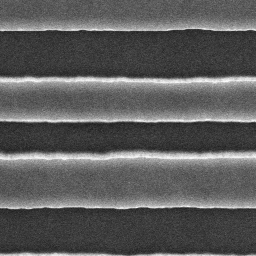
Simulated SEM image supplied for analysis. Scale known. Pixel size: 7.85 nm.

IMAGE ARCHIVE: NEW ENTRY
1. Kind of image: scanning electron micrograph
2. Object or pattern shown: lines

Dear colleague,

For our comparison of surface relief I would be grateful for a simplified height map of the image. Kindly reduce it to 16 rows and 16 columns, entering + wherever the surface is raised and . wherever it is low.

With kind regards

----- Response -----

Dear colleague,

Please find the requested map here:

++++++++++++++++
++++++++++++++++
................
................
................
++++++++++++++++
++++++++++++++++
.+++++++++++++++
................
................
++++++++++++++++
++++++++++++++++
++++++++++++++++
................
................
................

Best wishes